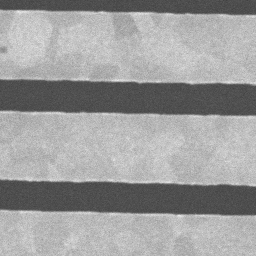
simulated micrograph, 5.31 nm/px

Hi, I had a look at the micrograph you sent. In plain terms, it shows lines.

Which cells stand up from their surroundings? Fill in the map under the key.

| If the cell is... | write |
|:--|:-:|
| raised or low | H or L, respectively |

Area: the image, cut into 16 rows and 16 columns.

LLLLLLLLLLLLLLLL
HHHHHHHHHHHHHHHH
HHHHHHHHHHHHHHHH
HHHHHHHHHHHHHHHH
HHHHHHHHHHHHHHHH
LLLLLLLLLLLLLLLL
LLLLLLLLLLLLLLLL
HHHHHHHHHHHHHHHH
HHHHHHHHHHHHHHHH
HHHHHHHHHHHHHHHH
HHHHHHHHHHHHHHHH
LLLLLLLLLLLLHHHH
LLLLLLLLLLLLLLLL
HHHHHHHHHHHHHHLL
HHHHHHHHHHHHHHHH
HHHHHHHHHHHHHHHH